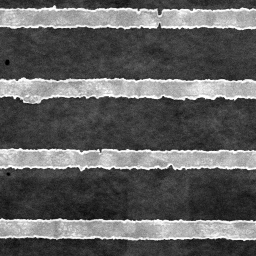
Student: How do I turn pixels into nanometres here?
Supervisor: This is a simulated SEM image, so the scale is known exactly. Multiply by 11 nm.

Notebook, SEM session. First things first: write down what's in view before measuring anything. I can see one or a few lines or trenches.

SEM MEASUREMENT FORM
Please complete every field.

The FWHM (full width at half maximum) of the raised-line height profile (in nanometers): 193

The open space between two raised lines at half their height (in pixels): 53.4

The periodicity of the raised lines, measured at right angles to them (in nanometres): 776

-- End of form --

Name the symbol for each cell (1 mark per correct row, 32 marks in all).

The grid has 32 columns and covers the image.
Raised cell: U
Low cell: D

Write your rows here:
DDDDDDDDDDDDDDDDDDDDDDDDDDDDDDDD
UUUUUUUUUUUUUUUUUUUDUUUUUUUUUUUU
UDUUUUUUUUUUUUUUUUUUUUUUUUUUUUUU
DDDDDDDDDDDDDDDDDDDDDDDDDDDDDUUD
DDDDDDDDDDDDDDDDDDDDDDDDDDDDDDDD
DDDDDDDDDDDDDDDDDDDDDDDDDDDDDDDD
DDDDDDDDDDDDDDDDDDDDDDDDDDDDDDDD
DDDDDDDDDDDDDDDDDDDDDDDDDDDDDDDD
DDDDDDDDDDDDDDDDDDDDDDDDDDDDDDDD
DDDDDDDDDDDDDDDDDDDDDDDDDDDDDDDD
UUUUUUUUUUUUUUUUUUUUUUUUUUUUUUUU
UUUUUUUUUUUUUUUUUUUUUUUUUUUUUUUU
DDDUUDDDDDDDDDDDDDDDDDDDDDDDDDDD
DDDDDDDDDDDDDDDDDDDDDDDDDDDDDDDD
DDDDDDDDDDDDDDDDDDDDDDDDDDDDDDDD
DDDDDDDDDDDDDDDDDDDDDDDDDDDDDDDD
DDDDDDDDDDDDDDDDDDDDDDDDDDDDDDDD
DDDDDDDDDDDDDDDDDDDDDDDDDDDDDDDD
DDDDDDDDDDDDDDDDDDDDDDDDDDDDDDDD
UUUUUUUUUUUUUUUUUUUUUUUUUUUUUUUU
UUUUUUUUUUUUUUUUUUUUUUUUUUUUUUUU
DDDDDDDDDDDDDDDDDDDDDDDDDDDDDDDD
DDDDDDDDDDDDDDDDDDDDDDDDDDDDDDDD
DDDDDDDDDDDDDDDDDDDDDDDDDDDDDDDD
DDDDDDDDDDDDDDDDDDDDDDDDDDDDDDDD
DDDDDDDDDDDDDDDDDDDDDDDDDDDDDDDD
DDDDDDDDDDDDDDDDDDDDDDDDDDDDDDDD
UDDDDDDUDDDDDDDDDDDDDDDDDDDDDDDD
UUUUUUUUUUUUUUUUUUUUUUUUUUUUUUUU
UUUUUUUUUUUUUUUUUUUUUUUUUUDUUUUU
DDDDDDDDDDDDDDDDDDDDDDDDDDDDDDDD
DDDDDDDDDDDDDDDDDDDDDDDDDDDDDDDD